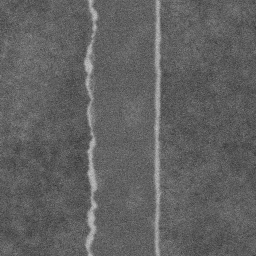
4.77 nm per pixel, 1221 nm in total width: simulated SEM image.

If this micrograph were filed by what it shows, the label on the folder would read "one or a few lines or trenches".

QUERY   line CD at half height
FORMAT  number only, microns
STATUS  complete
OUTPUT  0.323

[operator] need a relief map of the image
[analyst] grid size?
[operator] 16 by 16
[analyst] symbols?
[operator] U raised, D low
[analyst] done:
DDDDDDUUUUDDDDDD
DDDDDDUUUUDDDDDD
DDDDDDUUUUDDDDDD
DDDDDUUUUUDDDDDD
DDDDDUUUUUDDDDDD
DDDDDUUUUUDDDDDD
DDDDDDUUUUDDDDDD
DDDDDDUUUUDDDDDD
DDDDDDUUUUDDDDDD
DDDDDDUUUUDDDDDD
DDDDDDUUUUDDDDDD
DDDDDDUUUUDDDDDD
DDDDDDUUUUDDDDDD
DDDDDDUUUUDDDDDD
DDDDDDUUUUDDDDDD
DDDDDUUUUUDDDDDD